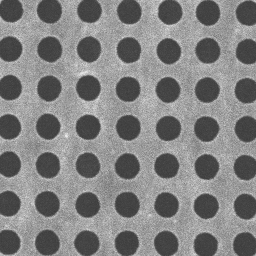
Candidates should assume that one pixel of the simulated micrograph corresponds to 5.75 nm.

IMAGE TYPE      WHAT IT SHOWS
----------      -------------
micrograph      a regular array of holes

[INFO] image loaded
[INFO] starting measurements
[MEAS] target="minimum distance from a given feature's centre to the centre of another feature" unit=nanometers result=220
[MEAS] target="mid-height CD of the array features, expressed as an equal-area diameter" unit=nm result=146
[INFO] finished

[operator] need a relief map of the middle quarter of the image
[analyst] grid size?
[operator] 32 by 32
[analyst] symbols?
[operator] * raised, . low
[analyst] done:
********************************
********************************
********************************
****....*******..********..*****
***......*****.....*****....****
***......****......****......***
***......****......****......***
***......****......****......***
****....******....******....****
***************..********..*****
********************************
********************************
********************************
****....******....******....****
***......****......****......***
***......****......****......***
***......****......****......***
***......****......****......***
****....******....******....****
********************************
********************************
********************************
*****..********..********..*****
***.....******....*****.....****
***......****......****......***
***......****......***.......***
***......****......****......***
****....*****.....*****.....****
******.*******...********..*****
********************************
********************************
********************************